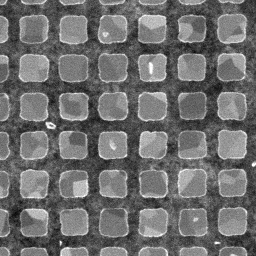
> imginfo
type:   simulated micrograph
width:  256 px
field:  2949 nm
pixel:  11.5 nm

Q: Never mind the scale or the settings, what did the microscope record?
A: a regular array of raised bodies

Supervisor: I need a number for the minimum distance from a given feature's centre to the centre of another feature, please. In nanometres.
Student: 443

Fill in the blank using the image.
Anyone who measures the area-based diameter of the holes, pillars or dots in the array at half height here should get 30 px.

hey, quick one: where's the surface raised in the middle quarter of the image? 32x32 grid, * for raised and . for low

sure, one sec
******...*******...******....***
******...*******...******....***
******...*******...******....***
******...******....******....***
..........*.....................
................................
................................
*****.....*****....******....***
******...*******...*******...***
******...*******...*******...***
******...*******...*******...***
******...*******...*******...***
******...*******...******....***
******....*****....******....***
................................
................................
................................
*****....******.....*****....***
******...*******...*******...***
******...*******...*******...***
******...*******...*******...***
******...*******...*******...***
******...*******...******....***
*****.....***.........**......**
................................
................................
..............................**
******...*******...******....***
******...*******...*******...***
******...******....*******...***
******...*******...*******...***
******...*******...*******...***